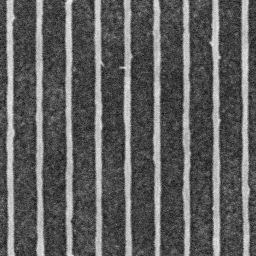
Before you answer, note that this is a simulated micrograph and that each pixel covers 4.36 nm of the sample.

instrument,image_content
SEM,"parallel lines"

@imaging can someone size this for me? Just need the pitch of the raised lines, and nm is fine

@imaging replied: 128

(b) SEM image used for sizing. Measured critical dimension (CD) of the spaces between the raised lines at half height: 107 nm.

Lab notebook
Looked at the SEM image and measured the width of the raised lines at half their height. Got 22.3 nm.